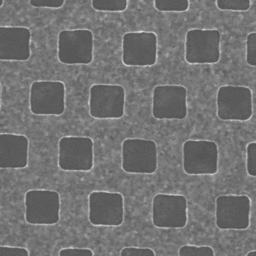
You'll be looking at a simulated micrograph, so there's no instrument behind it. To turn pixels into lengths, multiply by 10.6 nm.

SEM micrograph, a regular array of holes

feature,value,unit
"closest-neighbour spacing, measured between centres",61.3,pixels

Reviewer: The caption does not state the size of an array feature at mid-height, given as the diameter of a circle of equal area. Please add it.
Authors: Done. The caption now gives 0.39 µm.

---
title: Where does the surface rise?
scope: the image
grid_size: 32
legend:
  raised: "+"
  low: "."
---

++++....++++....+++.....+++....+
++++++++++++++++++++++++++++++++
++++++++++++++++++++++++++++++++
...+++++++++++++++++++++++++++++
....+++.....++++...++++....++++.
....+++.....+++.....+++....++++.
....+++.....+++.....+++....++++.
+..+++++...++++....++++....++++.
++++++++++++++++++++++++++++++++
++++++++++++++++++++++++++++++++
++++....++++++++++++++++++++++++
++++....+++.....+++....++++....+
++++....+++.....+++....++++.....
++++....+++.....+++....++++.....
++++++++++++...++++....++++....+
++++++++++++++++++++++++++++++++
++++++++++++++++++++++++++++++++
...+++++...+++++..++++++++++++++
...++++.....+++.....+++....++++.
...++++.....+++.....+++....++++.
...++++.....+++.....+++....++++.
++++++++++++++++...++++....++++.
++++++++++++++++++++++++++++++++
++++++++++++++++++++++++++++++++
+++....++++....+++++...+++++...+
+++....++++....++++....++++....+
+++....++++....++++....++++....+
+++....++++....++++....++++....+
+++++++++++++++++++++.++++++...+
++++++++++++++++++++++++++++++++
++++++++++++++++++++++++++++++++
...+++++...++++....+++.....++++.